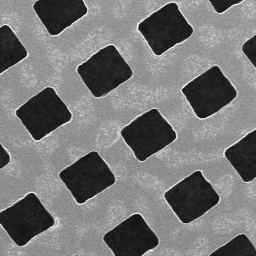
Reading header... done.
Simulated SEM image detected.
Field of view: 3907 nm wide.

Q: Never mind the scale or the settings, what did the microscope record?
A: holes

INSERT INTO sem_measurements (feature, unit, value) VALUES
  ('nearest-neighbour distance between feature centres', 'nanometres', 1130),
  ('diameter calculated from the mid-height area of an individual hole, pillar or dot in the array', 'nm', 712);